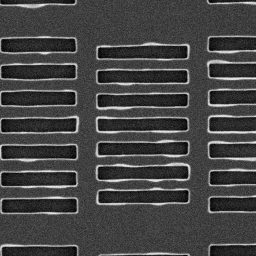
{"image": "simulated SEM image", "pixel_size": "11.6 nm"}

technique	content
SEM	groups of lines, slits or small figures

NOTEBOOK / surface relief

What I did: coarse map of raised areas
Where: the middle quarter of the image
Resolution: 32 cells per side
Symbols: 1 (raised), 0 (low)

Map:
00011111111111111111111111111111
00011111100000000000000000000011
00011111000000000000000000000001
00011111000000000000000000000001
11111111000000000000000000000001
11111111111111111111111111111111
11111111111111111111111111111111
00011111101111111100000000000011
00011111000000000000000000000001
00011111000000000000000000000001
11111111000000000000000000000001
11111111111111111111111111111111
11111111111111111111111111111111
11011111101111111111111000011111
00011111000000000000000000000001
00011111000000000000000000000001
00011111000000000000000000000011
11111111111111111111111111111111
11111111111111111111111111111111
11111111100000000000011100000001
00011111000000000000000000000001
00011111000000000000000000000001
00011111000000000000000000000001
00011111111111111111111111111111
11111111111111111111111111111111
11111111100000001111100000000001
11111111000000000000000000000001
00011111000000000000000000000001
00011111000000000000000000000001
00011111111111111111111111111111
00011111111111111111111111111111
11111111111111111111110001110011